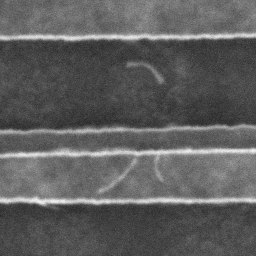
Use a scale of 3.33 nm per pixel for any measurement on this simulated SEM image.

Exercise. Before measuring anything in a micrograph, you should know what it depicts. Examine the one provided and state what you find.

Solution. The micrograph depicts lines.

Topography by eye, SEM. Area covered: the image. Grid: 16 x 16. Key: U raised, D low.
UUUUUUUUUUUUUUUU
UUUUUUUUUUUUUUUU
DDDDDDDDDDDDDDDD
DDDDDDDDDDDDDDDD
DDDDDDDDDDDDDDDD
DDDDDDDDDDDDDDDD
DDDDDDDDDDDDDDDD
DDDDDDDDDDDDDDDD
UUUUUUUUUUUUUUUU
UUUUUUUUUUUUUUUU
UUUUUUUUUUUUUUUU
UUUUUUUUUUUUUUUU
UUUUUUUUUUUUUUUU
DDDDDDDDDDDDDDDD
DDDDDDDDDDDDDDDD
DDDDDDDDDDDDDDDD